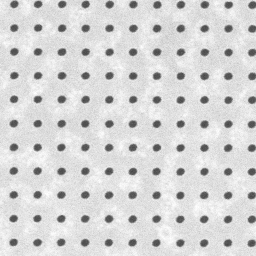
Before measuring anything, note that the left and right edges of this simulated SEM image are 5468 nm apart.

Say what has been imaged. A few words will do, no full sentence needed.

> a regular array of holes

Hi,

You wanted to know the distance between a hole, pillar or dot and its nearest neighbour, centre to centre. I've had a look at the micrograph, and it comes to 500 nanometers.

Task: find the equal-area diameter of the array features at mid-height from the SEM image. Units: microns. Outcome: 0.187